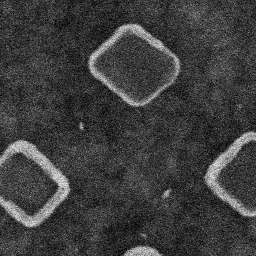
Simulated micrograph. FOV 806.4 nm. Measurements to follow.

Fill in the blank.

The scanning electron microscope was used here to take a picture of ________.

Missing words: raised bodies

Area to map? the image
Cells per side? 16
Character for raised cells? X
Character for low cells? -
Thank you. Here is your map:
----------------
----------------
-------XXX------
------XXXXX-----
------XXXXX-----
-------XXX------
--------X-------
----------------
---------------X
XX------------XX
XXX----------XXX
XXXX---------XXX
XXXX----------XX
-XX-------------
----------------
----------------